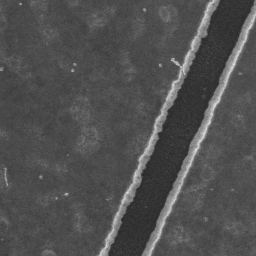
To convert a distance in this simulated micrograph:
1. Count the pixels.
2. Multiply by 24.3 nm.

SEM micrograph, one or a few lines or trenches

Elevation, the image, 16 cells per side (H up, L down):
HHHHHHHHHHHHHLLL
HHHHHHHHHHHHHLLL
HHHHHHHHHHHHLLLH
HHHHHHHHHHHHLLLH
HHHHHHHHHHHLLLHH
HHHHHHHHHHHLLLHH
HHHHHHHHHHHLLHHH
HHHHHHHHHHLLLHHH
HHHHHHHHHHLLLHHH
HHHHHHHHHLLLHHHH
HHHHHHHHHLLLHHHH
HHHHHHHHLLLHHHHH
HHHHHHHHLLLHHHHH
HHHHHHHLLLHHHHHH
HHHHHHHLLLHHHHHH
HHHHHHHLLHHHHHHH